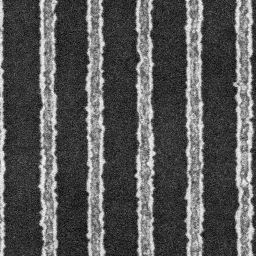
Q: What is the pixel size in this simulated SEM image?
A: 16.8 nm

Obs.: parallel lines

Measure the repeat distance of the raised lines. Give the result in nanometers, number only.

825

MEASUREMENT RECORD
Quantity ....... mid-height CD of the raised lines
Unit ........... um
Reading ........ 0.206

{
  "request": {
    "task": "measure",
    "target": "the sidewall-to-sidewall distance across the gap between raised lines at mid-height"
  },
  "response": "625 nm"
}